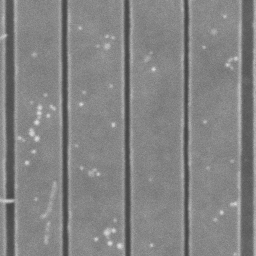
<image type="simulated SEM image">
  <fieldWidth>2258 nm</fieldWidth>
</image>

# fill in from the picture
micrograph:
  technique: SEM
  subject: lines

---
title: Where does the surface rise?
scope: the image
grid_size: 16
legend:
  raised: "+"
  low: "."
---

.++++++++++++++.
.++++++++++++++.
.++++++++++++++.
.++++++++++++++.
.++++++++++++++.
.++++++++++++++.
.++++++++++++++.
.++++++++++++++.
.++++++++++++++.
.++++++++++++++.
.++++++++++++++.
.++++++++++++++.
.++++++++++++++.
.++++++++++++++.
.++++++++++++++.
.++++++++++++++.